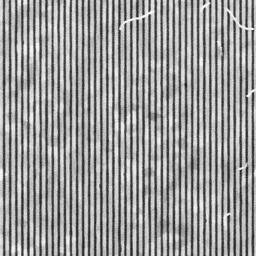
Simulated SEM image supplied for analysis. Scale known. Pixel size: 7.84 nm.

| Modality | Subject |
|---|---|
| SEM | parallel lines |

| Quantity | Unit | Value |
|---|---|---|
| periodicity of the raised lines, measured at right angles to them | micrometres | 0.0475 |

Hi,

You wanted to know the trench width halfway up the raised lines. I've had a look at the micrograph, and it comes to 0.0255 µm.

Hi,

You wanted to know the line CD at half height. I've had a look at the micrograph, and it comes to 0.0255 µm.